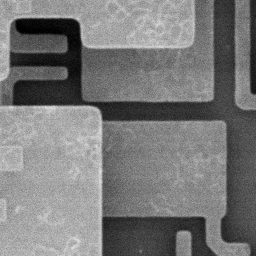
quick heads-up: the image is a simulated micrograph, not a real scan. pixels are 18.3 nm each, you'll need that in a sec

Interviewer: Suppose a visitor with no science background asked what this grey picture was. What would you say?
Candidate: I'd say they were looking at wiring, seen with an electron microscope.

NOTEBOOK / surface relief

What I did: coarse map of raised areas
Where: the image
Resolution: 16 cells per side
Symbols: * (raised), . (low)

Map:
************....
*....*******....
*....*******....
*...............
*...............
................
................
******..........
******..........
******..........
******..........
******..........
******..........
******..........
******..........
******..........